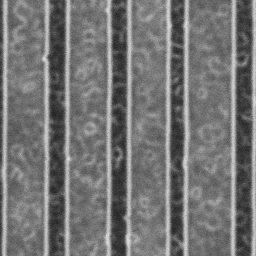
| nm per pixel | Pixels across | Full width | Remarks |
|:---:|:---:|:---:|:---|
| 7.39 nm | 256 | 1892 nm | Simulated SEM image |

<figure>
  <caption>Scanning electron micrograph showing one or a few lines or trenches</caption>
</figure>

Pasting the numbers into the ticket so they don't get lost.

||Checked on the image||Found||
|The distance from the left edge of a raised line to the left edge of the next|459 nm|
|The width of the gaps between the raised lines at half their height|0.303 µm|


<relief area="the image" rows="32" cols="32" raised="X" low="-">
X-----XX------XX-----XX------XXX
X-----XX------XX-----XX------XXX
X-----XX------XX-----XX------XXX
X-----XX------XX-----XX------XXX
X-----XX------XX-----XX------XXX
X-----XX------XX-----XX------XXX
X-----XX------XX-----XX------XXX
X-----XX------XX-----XX------XXX
X-----XX------XX-----XX------XXX
X-----XX------XX-----XX------XXX
X-----XX------XX-----XX------XXX
X-----XX------XX-----XX------XXX
X-----XX------XX-----XX------XXX
X-----XX------XX-----XX------XXX
X-----XX------XX-----XX------XXX
X-----XX------XX-----XX------XXX
X-----XX------XX-----XX------XXX
X-----XX------XX-----XX------XXX
X-----XX------XX-----XX------XXX
X-----XXX-----XX-----XX------XXX
X-----XX------XX-----XX------XXX
X-----XX------XX-----XX------XXX
X-----XX------XX-----XX------XXX
X-----XX------XX-----XX------XXX
X-----XX------XX-----XX------XXX
X-----XX------XX-----XX------XXX
X-----XX------XX-----XX------XXX
X-----XX------XX-----XX------XXX
X-----XX------XX-----XX------XXX
X-----XX------XX-----XX------XXX
X-----XX------XX-----XX------XXX
X-----XX------XX-----XX------XXX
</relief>